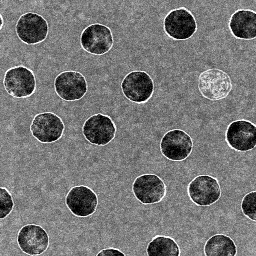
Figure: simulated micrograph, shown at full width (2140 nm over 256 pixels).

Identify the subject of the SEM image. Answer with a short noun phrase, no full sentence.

a regular array of holes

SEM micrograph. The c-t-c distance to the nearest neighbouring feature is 0.444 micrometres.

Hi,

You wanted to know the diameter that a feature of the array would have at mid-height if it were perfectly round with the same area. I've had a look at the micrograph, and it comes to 256 nm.